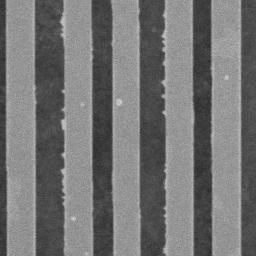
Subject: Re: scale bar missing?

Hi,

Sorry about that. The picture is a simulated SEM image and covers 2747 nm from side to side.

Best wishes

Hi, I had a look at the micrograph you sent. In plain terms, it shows lines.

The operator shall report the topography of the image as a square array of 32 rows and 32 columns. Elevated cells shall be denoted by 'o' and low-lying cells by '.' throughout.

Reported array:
.ooo....ooo...ooo....ooo..oooo..
.ooo....ooo...ooo....ooo..oooo..
.ooo....ooo...ooo....ooo..oooo..
.ooo....ooo...ooo....ooo..oooo..
.ooo....ooo...ooo....ooo..oooo..
.ooo....ooo...ooo....ooo..oooo..
.ooo....ooo...ooo....ooo..oooo..
.ooo....ooo...ooo....ooo..oooo..
.ooo....ooo...ooo....ooo...ooo..
.ooo....ooo...ooo....ooo...ooo..
.ooo....ooo...ooo....ooo...ooo..
.ooo....ooo...ooo....ooo...ooo..
.ooo....ooo...ooo....ooo...ooo..
.ooo....ooo...ooo....ooo...ooo..
.ooo....ooo...ooo....ooo...ooo..
.ooo....ooo...ooo....ooo...ooo..
.ooo....ooo...ooo....ooo...ooo..
.ooo....ooo...ooo....ooo...ooo..
.ooo....ooo...ooo....ooo...ooo..
.ooo....ooo...ooo....ooo...ooo..
.ooo....ooo...ooo....ooo...ooo..
.ooo....ooo...ooo....ooo...ooo..
.ooo....ooo...ooo....ooo...ooo..
.ooo....ooo...ooo....ooo...ooo..
.ooo....ooo...ooo....ooo...ooo..
.ooo....ooo...ooo....ooo...ooo..
.ooo....ooo...ooo....ooo...ooo..
.ooo....ooo...ooo....ooo...ooo..
.ooo....oooo..ooo....ooo...ooo..
.ooo....oooo..ooo....ooo...ooo..
.ooo....oooo..ooo....ooo...ooo..
.ooo....oooo..ooo....ooo...ooo..